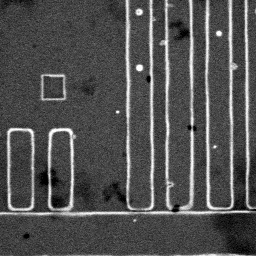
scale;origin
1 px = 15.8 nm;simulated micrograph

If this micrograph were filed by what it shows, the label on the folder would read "wiring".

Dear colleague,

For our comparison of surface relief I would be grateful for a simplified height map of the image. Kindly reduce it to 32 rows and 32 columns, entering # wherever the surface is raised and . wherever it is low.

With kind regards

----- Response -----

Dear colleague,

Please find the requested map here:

................###..###..###..#
................###..###..###..#
................###..###..###..#
................###..###..###..#
................###..###..###..#
................###..###..###..#
................###..###..###..#
................###..###..###..#
................###..###..###..#
................###..###..###..#
................###..###..###..#
................###..###..###..#
................###..###..###..#
................###..###..###..#
................###..###..###..#
................###..###..###..#
.###...##.......###..###..###..#
.###..###.......###..###..###..#
.###..###.......###..###..###..#
.###..###.......###..###..###..#
.###..###.......###..###..###..#
.###..###.......###..###..###..#
.###..###.......###..###..###..#
.###..###.......###..###..###..#
.###..###.......###..###..###..#
.###..###.......###..###..###..#
.###...#........###..##...###.##
################################
################################
################################
################################
################################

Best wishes